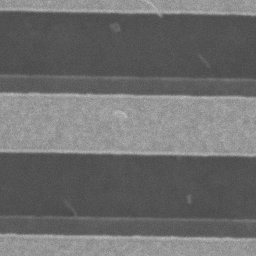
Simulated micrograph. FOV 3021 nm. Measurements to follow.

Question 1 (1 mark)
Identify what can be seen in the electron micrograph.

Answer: lines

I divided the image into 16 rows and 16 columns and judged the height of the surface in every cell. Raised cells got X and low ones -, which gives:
XXXXXXXXXXXXXXXX
----------------
----------------
----------------
----------------
XXXXXXXXXXXXXXXX
XXXXXXXXXXXXXXXX
XXXXXXXXXXXXXXXX
XXXXXXXXXXXXXXXX
---XXXXXXXXXXXXX
----------------
----------------
----------------
----------------
XXXXXXXXXXXXXXXX
XXXXXXXXXXXXXXXX